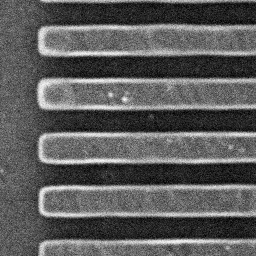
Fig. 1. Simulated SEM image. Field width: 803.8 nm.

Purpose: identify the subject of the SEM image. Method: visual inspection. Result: wiring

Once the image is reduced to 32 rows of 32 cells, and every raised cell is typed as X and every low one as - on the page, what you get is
--------------------------------
--------------------------------
--------------------------------
-----XXXXXXXXXXXXXXXXXXXXXXXXXXX
-----XXXXXXXXXXXXXXXXXXXXXXXXXXX
-----XXXXXXXXXXXXXXXXXXXXXXXXXXX
-----XXXXXXXXXXXXXXXXXXXXXXXXXXX
--------------------------------
--------------------------------
--------------------------------
-----XXXXXXXXXXXXXXXXXXXXXXXXXXX
-----XXXXXXXXXXXXXXXXXXXXXXXXXXX
-----XXXXXXXXXXXXXXXXXXXXXXXXXXX
-----XXXXXXXXXXXXXXXXXXXXXXXXX--
--------------------------------
--------------------------------
--------------------------------
-----XXXXXXXXXXXXXXXXXXXXXXXXXXX
-----XXXXXXXXXXXXXXXXXXXXXXXXXXX
-----XXXXXXXXXXXXXXXXXXXXXXXXXXX
--------------------------------
--------------------------------
--------------------------------
-----XXXXXXXXXXXXXXXXXXXXXXXXXXX
-----XXXXXXXXXXXXXXXXXXXXXXXXXXX
-----XXXXXXXXXXXXXXXXXXXXXXXXXXX
-----XXXXXXXXXXXXXXXXXXXXXXXXXXX
--------------------------------
--------------------------------
--------------------------------
-----XXXXXXXXXXXXXXXXXXXXXXXXXXX
-----XXXXXXXXXXXXXXXXXXXXXXXXXXX